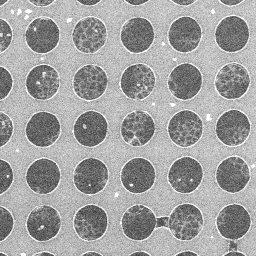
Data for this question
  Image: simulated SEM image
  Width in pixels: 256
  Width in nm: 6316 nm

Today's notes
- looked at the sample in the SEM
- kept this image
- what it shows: a regular array of raised bodies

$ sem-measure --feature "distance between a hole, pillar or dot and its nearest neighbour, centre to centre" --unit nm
1150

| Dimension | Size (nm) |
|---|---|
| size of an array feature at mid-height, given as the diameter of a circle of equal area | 878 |